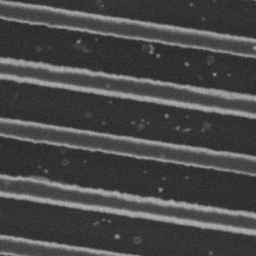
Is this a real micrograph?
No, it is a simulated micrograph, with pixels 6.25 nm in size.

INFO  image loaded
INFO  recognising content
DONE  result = lines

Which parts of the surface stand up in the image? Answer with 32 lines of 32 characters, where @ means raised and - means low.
@@@-----------------------------
@@@@@@@@@@----------------------
-@@@@@@@@@@@@@@@@---------------
--------@@@@@@@@@@@@@@@---------
--------------@@@@@@@@@@@@@@@---
---------------------@@@@@@@@@@@
---------------------------@@@@@
@@------------------------------
@@@@@@@@------------------------
@@@@@@@@@@@@@@@-----------------
-----@@@@@@@@@@@@@@@@@----------
------------@@@@@@@@@@@@@@@@----
-------------------@@@@@@@@@@@@@
------------------------@@@@@@@@
-------------------------------@
@@@@@---------------------------
@@@@@@@@@@@@--------------------
---@@@@@@@@@@@@@@@--------------
---------@@@@@@@@@@@@@@@@-------
----------------@@@@@@@@@@@@@@@-
-----------------------@@@@@@@@@
-----------------------------@@@
@@@@----------------------------
@@@@@@@@@@----------------------
-@@@@@@@@@@@@@@@@---------------
-------@@@@@@@@@@@@@@@@---------
--------------@@@@@@@@@@@@@@@---
--------------------@@@@@@@@@@@@
---------------------------@@@@@
@-------------------------------
@@@@@@@@------------------------
@@@@@@@@@@@@@@------------------